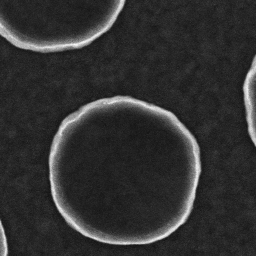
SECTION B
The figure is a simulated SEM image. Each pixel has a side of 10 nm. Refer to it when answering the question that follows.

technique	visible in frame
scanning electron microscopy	raised bodies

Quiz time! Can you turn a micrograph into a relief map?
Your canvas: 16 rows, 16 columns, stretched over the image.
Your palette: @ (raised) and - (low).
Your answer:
@@@@@@@---------
@@@@@@@---------
-@@@@@----------
----------------
----------------
---------------@
------@@@------@
----@@@@@@@-----
----@@@@@@@@----
---@@@@@@@@@----
---@@@@@@@@@----
---@@@@@@@@@----
---@@@@@@@@@----
----@@@@@@@@----
-----@@@@@@-----
----------------